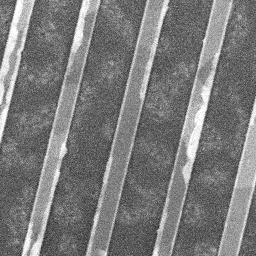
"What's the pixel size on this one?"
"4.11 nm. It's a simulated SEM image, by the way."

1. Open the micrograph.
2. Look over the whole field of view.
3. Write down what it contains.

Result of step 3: one or a few lines or trenches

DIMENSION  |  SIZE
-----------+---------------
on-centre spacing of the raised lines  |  263 nm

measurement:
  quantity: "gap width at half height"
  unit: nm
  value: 190